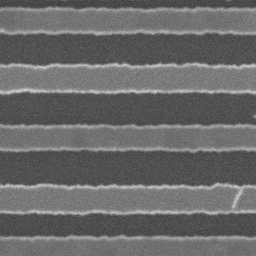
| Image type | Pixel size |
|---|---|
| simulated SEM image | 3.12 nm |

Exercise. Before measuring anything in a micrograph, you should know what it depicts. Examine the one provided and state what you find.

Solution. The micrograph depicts lines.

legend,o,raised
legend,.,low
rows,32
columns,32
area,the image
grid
................................
oooooooooooooooooooooooooooooooo
oooooooooooooooooooooooooooooooo
oooooooooooooooooooooooooooooooo
................................
................................
................................
................................
oooooooooooooooooooooooooooooooo
oooooooooooooooooooooooooooooooo
oooooooooooooooooooooooooooooooo
oo........ooooo...........o.oooo
................................
................................
................................
................................
oooooooooooooooooooooooooooooooo
oooooooooooooooooooooooooooooooo
oooooooooooooooooooooooooooooooo
................................
................................
................................
................................
oooooooooooooooooooooooooooooooo
oooooooooooooooooooooooooooooooo
oooooooooooooooooooooooooooooooo
oooooooooooooooooooooooooooooooo
................................
................................
................................
oooooooooooooooooooooooooooooooo
oooooooooooooooooooooooooooooooo